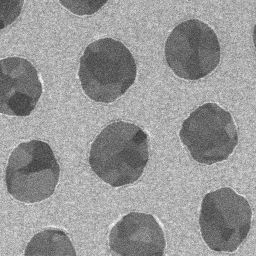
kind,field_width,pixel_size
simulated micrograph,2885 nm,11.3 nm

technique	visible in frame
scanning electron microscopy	raised bodies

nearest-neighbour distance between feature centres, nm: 966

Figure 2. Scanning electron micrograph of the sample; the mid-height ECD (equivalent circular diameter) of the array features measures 60.2 pixels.